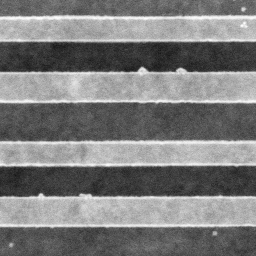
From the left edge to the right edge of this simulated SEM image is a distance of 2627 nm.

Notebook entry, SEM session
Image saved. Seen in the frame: lines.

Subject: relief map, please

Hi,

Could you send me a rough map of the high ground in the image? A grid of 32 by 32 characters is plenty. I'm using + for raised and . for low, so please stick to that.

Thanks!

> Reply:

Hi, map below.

................................
................................
++++++++++++++++++++++++++++++++
++++++++++++++++++++++++++++++++
++++++++++++++++++++++++++++++++
................................
................................
................................
................................
++++++++++++++++++++++++++++++++
++++++++++++++++++++++++++++++++
++++++++++++++++++++++++++++++++
++++++++++++++++++++++++++++++++
................................
................................
................................
................................
................................
++++++++++++++++++++++++++++++++
++++++++++++++++++++++++++++++++
++++++++++++++++++++++++++++++++
................................
................................
................................
.....+....++....................
++++++++++++++++++++++++++++++++
++++++++++++++++++++++++++++++++
++++++++++++++++++++++++++++++++
................................
................................
................................
................................